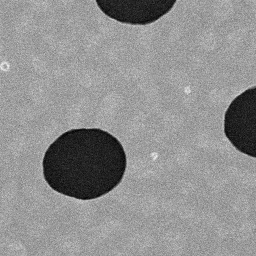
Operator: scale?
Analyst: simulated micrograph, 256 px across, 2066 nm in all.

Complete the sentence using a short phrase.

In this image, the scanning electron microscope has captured holes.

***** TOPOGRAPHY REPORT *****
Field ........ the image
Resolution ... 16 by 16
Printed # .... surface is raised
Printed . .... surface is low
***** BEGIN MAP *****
######.....#####
########.#######
################
################
################
################
##############..
##############..
####...#######..
###.....#######.
###.....########
###....#########
################
################
################
################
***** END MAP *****